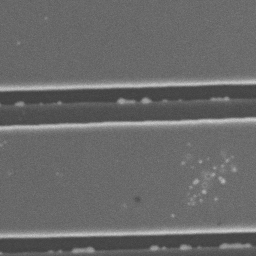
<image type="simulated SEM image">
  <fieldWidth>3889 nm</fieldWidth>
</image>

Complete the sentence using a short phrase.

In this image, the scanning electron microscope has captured lines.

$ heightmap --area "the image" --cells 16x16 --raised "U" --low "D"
UUUUUUUUUUUUUUUU
UUUUUUUUUUUUUUUU
UUUUUUUUUUUUUUUU
UUUUUUUUUUUUUUUU
UUUUUUUUUUUUUUUU
UUUUUDDDDDDDDDDD
DDDDDDDDDDDDDDDD
DDDDDDDDDDDDUUUU
UUUUUUUUUUUUUUUU
UUUUUUUUUUUUUUUU
UUUUUUUUUUUUUUUU
UUUUUUUUUUUUUUUU
UUUUUUUUUUUUUUUU
UUUUUUUUUUUUUUUU
UUUUUUUUUUUUUUUD
DDDDDDDDDDDDDDDD